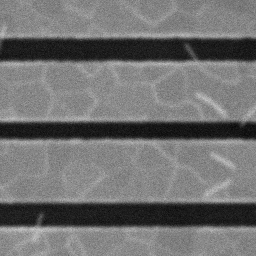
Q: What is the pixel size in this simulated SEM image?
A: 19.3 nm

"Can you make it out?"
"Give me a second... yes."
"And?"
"lines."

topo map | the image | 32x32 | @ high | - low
@@@@@@@@@@@@@@@@@@@@@@@@@@@@@@@@
@@@@@@@@@@@@@@@@@@@@@@@@@@@@@@@@
@@@@@@@@@@@@@@@@@@@@@@@@@@@@@@@@
@@@@@@@@@@@@@@@@@@@@@@@@@@@@@@@@
@@@@@@@@@@@@@@@@@@@@@@@@@@@@@@@@
--------------------------------
--------------------------------
--------------------------------
@@@@@@@@@@@@@@@@@@@@@@@@@@@@@@@@
@@@@@@@@@@@@@@@@@@@@@@@@@@@@@@@@
@@@@@@@@@@@@@@@@@@@@@@@@@@@@@@@@
@@@@@@@@@@@@@@@@@@@@@@@@@@@@@@@@
@@@@@@@@@@@@@@@@@@@@@@@@@@@@@@@@
@@@@@@@@@@@@@@@@@@@@@@@@@@@@@@@@
@@@@@@@@@@@@@@@@@@@@@@@@@@@@@@@@
--------------------------------
--------------------------------
--------------------------------
@@@@@@@@@@@@@@@@@@@@@@@@@@@@@@@@
@@@@@@@@@@@@@@@@@@@@@@@@@@@@@@@@
@@@@@@@@@@@@@@@@@@@@@@@@@@@@@@@@
@@@@@@@@@@@@@@@@@@@@@@@@@@@@@@@@
@@@@@@@@@@@@@@@@@@@@@@@@@@@@@@@@
@@@@@@@@@@@@@@@@@@@@@@@@@@@@@@@@
@@@@@@@@@@@@@@@@@@@@@@@@@@@@@@@@
--------------------------------
--------------------------------
--------------------------------
----@---------------@-----------
@@@@@@@@@@@@@@@@@@@@@@@@@@@@@@@@
@@@@@@@@@@@@@@@@@@@@@@@@@@@@@@@@
@@@@@@@@@@@@@@@@@@@@@@@@@@@@@@@@